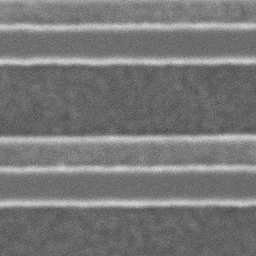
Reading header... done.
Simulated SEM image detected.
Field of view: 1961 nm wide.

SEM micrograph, lines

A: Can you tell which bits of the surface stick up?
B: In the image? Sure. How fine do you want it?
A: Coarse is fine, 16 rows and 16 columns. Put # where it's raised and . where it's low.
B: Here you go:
################
################
################
################
................
................
................
................
................
################
################
################
################
................
................
................